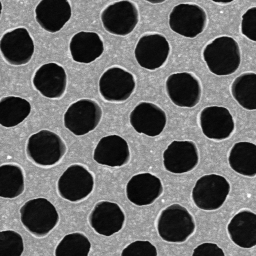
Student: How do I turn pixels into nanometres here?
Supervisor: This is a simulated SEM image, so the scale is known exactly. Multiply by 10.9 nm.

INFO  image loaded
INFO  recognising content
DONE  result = a regular array of holes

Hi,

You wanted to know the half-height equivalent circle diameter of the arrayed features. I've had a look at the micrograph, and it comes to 371 nanometres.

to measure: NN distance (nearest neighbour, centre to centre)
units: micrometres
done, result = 0.508